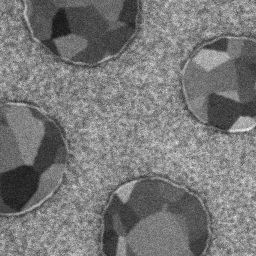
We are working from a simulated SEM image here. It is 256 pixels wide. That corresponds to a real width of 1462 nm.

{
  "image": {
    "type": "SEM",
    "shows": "raised bodies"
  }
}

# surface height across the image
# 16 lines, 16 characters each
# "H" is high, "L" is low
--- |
LLHHHHHHHLLLLLLL
LLHHHHHHHLLLLLLL
LLHHHHHHLLLLLHHH
LLLLHHHLLLLLHHHH
LLLLLLLLLLLHHHHH
LLLLLLLLLLLHHHHH
HLLLLLLLLLLLHHHH
HHHLLLLLLLLLLHHH
HHHHLLLLLLLLLLLL
HHHHLLLLLLLLLLLL
HHHHLLLLLLLLLLLL
HHHHLLLLHHHLLLLL
HHHLLLLHHHHHHLLL
LLLLLLHHHHHHHLLL
LLLLLLHHHHHHHLLL
LLLLLLHHHHHHHLLL